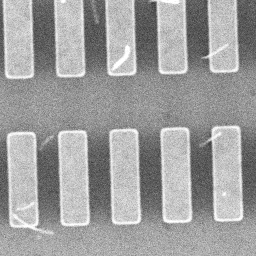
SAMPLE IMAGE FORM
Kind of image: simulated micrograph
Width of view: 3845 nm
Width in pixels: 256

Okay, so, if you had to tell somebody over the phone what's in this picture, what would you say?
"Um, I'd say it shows groups of lines, slits or small figures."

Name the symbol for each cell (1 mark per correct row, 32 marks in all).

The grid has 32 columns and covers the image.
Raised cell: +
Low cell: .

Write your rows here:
++++...+++...++++...+++...+++...
.+++...+++...++++...+++...+++...
.+++...+++...++++...+++...+++...
.+++...+++...++++...+++...++++..
.+++...+++...++++...+++...++++..
.+++...+++...++++...+++...++++..
.+++...+++...++++...+++...++++..
.+++...++++..++++...+++...++++..
.+++...++++..++++...+++...++++..
.+++............................
................................
................................
................................
................................
................................
................................
........++....+++...+++....+++..
.+++...++++...+++...++++...+++..
.+++...++++...+++...++++...+++..
.+++...++++...+++...++++...+++..
.+++...++++...+++...++++...+++..
.+++....+++...+++...++++...+++..
.+++....+++...+++...++++...+++..
.++++...+++...+++...++++...+++..
.++++...+++...+++...++++...+++..
.++++...+++...+++...++++...+++..
.++++...+++...+++...++++...+++..
.++++...+++...+++....+++...+++..
................................
................................
................................
................................